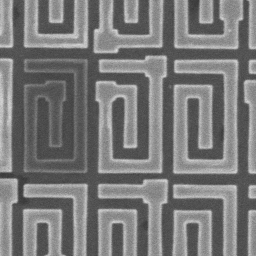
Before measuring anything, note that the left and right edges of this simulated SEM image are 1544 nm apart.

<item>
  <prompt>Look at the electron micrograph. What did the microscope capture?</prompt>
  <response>wiring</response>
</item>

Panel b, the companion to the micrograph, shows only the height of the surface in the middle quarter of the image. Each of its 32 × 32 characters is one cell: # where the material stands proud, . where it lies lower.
######...################...####
######...################...####
..####..............#####.......
...###...............####.......
...###..####..........##........
...##...##########....##....####
...###..##########....##....####
...###..##########...###....####
...###..#####..###...###....###.
...###...###...###...###....###.
...###...###...###...###....###.
...###...###...###...###....###.
...###...###...###...###....###.
...###...###...###...###....###.
...###...###...###...###....###.
...###...###...###...###....###.
...###...###...###...###....###.
...###...###...###...###...####.
...###...###...###...###...####.
...##....###...###...###...####.
...##....###...###...###...####.
...##....###.........###...####.
...##....###.........###...####.
..###....###.........###...####.
######...###############...#####
######...###############...#####
######...###############...#####
................................
................................
....................######......
######...#################.#####
######...#################.#####